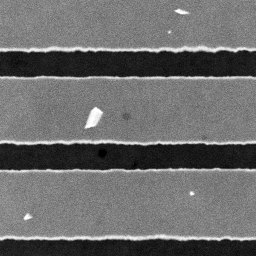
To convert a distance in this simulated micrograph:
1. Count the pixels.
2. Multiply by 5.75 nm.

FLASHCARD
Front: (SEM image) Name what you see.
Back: lines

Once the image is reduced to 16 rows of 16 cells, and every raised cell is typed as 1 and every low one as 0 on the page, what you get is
1111111111111111
1111111111111111
1111111111111111
0000000000000000
0000000000000000
1111111111111111
1111111111111111
1111111111111111
1111111111111111
0000000000000000
0000000000000000
1111111111111111
1111111111111111
1111111111111111
1111111111111111
0000000000000000